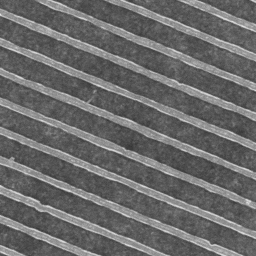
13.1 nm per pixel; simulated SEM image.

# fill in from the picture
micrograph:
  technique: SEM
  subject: parallel lines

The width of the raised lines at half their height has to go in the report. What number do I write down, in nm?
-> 77.3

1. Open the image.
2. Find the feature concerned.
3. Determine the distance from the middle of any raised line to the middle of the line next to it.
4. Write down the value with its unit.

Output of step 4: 27.4 px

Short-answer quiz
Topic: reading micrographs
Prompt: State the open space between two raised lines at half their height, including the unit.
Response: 276 nanometres